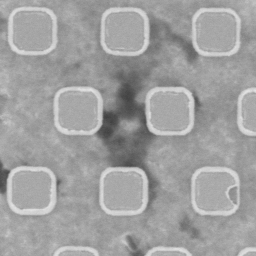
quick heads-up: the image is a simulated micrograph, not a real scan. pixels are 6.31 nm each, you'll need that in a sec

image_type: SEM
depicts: a regular array of raised bodies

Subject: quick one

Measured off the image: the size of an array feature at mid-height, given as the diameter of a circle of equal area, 309 nanometres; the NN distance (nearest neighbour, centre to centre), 0.576 um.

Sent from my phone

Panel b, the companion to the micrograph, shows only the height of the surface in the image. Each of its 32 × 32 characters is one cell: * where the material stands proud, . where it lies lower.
................................
..****.......*****.......****...
.******......*****......******..
.******......*****......******..
.******......*****......******..
.******......*****......******..
..****........****.......****...
................................
................................
................................
................................
.......*****.......****........*
.......*****......******......**
.......*****......******......**
.......******.....******......**
.......*****.......*****......**
........****.......****........*
................................
................................
................................
................................
..****.......*****.......****...
.******......*****......******..
.******......*****......*****...
.******......*****......*****...
.******......*****......*****...
..****........***........****...
................................
................................
................................
................................
.......*****.......****.......**